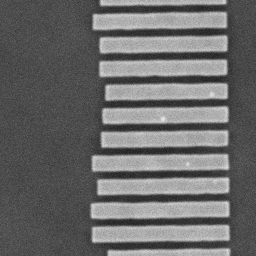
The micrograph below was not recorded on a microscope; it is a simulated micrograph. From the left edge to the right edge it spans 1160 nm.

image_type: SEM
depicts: groups of lines, slits or small figures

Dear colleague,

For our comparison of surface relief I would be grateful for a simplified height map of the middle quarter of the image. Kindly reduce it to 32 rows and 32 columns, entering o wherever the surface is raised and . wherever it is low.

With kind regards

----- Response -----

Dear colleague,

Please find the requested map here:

.........ooooooooooooooooooooooo
.........ooooooooooooooooooooooo
.........ooooooooooooooooooooooo
................................
................................
...........ooooooooooooooooooooo
...........ooooooooooooooooooooo
...........ooooooooooooooooooooo
..........oooooooooooooooooooooo
................................
................................
..........oooooooooooooooooooooo
..........oooooooooooooooooooooo
..........oooooooooooooooooooooo
..........ooooooooooooooooooooo.
................................
................................
.........ooooooooooooooooooooooo
.........ooooooooooooooooooooooo
.........ooooooooooooooooooooooo
.........oooooooooooooooo.......
................................
................................
.......ooooooooooooooooooooooooo
.......ooooooooooooooooooooooooo
.......ooooooooooooooooooooooooo
.......oooooooooooooooooo.......
................................
................................
.........ooooooooooooooooooooooo
.........ooooooooooooooooooooooo
.........ooooooooooooooooooooooo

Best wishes